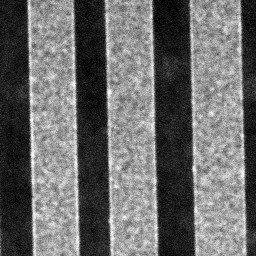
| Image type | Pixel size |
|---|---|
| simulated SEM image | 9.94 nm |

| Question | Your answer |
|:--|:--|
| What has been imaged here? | one or a few lines or trenches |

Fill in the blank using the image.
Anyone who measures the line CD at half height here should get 45.9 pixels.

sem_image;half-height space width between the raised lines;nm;325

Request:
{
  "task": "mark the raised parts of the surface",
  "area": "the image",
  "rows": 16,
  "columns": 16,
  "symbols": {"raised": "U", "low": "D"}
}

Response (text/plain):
DDUUUDDUUDDDUUUD
DDUUUDDUUDDDUUUD
DDUUUDDUUUDDUUUD
DDUUUDDUUUDDUUUD
DDUUUDDUUUDDUUUD
DDUUUDDUUUDDUUUD
DDUUUDDUUUDDUUUD
DDUUUDDUUUDDUUUD
DDUUUDDUUUDDUUUD
DDUUUDDUUUDDUUUD
DDUUUDDUUUDDUUUD
DDUUUDDUUUDDUUUD
DDUUUDDUUUDDUUUD
DDUUUDDUUUDDUUUD
DDUUUDDUUUDDUUUD
DDUUUDDUUUDDUUUD